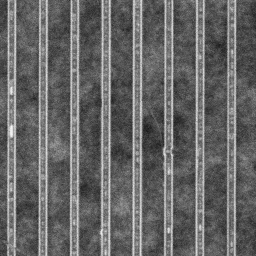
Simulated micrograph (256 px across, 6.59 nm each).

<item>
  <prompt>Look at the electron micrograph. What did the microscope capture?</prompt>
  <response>parallel lines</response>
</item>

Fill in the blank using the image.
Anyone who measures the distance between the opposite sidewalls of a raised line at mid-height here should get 7.62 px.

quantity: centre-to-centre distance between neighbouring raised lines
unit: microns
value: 0.207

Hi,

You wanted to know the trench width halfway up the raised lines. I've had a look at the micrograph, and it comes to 157 nm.